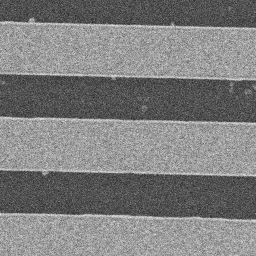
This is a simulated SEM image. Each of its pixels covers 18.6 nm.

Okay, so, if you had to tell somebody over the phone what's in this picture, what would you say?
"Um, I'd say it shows one or a few lines or trenches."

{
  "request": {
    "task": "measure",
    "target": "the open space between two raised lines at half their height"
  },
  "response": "822 nm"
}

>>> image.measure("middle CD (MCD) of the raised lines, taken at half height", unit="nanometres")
938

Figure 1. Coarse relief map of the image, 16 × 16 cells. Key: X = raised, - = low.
----------------
XXX-------------
XXXXXXXXXXXXXXXX
XXXXXXXXXXXXXXXX
XXXXXXXXXXXXXXXX
----------------
----------------
XXXX------------
XXXXXXXXXXXXXXXX
XXXXXXXXXXXXXXXX
XXXXXXXXXXXXXXXX
----------------
----------------
XXXXXXX---------
XXXXXXXXXXXXXXXX
XXXXXXXXXXXXXXXX